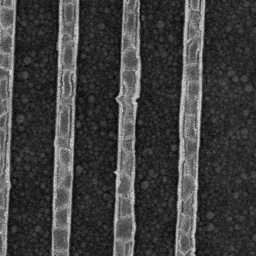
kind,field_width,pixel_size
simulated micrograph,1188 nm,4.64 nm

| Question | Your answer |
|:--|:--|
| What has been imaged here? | one or a few lines or trenches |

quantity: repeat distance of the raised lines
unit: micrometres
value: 0.29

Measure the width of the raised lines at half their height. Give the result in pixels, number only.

17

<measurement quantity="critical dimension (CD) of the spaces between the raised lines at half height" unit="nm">214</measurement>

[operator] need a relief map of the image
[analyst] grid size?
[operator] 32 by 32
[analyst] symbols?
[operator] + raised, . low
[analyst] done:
++......++......+......++.......
++......++......+......++.......
++......++.....++......++.......
++......++.....++......++.......
++.....+++.....++......++.......
++.....+++.....++......++.......
++......+......++......++.......
++.....++......++......++.......
+......++......++......++.......
+......++......++......++.......
+......++......++......++.......
+......++......++......++.......
+......++......++......++.......
+......++......++......++.......
+......++......++......++.......
+......++......++......++.......
+......++......++......++.......
+......++......++......++.......
+......++......++......++.......
+......++......++......++.......
+......++......++......++.......
+......++......++.....+++.......
+......++......++.....+++.......
+......++......++.....+++.......
+......++......++.....+++.......
+......++......++.....++........
+......++......++.....++........
+......++.....+++.....++........
+......++.....+++.....++........
+......++.....+++.....++........
+......++.....+++.....++........
+......++.....++......++........